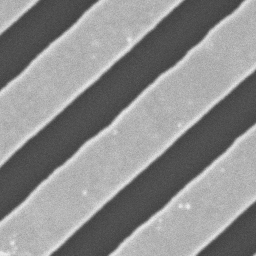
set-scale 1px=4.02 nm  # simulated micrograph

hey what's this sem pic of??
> lines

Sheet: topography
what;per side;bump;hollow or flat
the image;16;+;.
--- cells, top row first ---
++....+++++....+
+....+++++....++
...++++++....+++
..++++++....++++
.++++++...++++++
+++++....++++++.
++++....++++++..
+++....+++++....
++....+++++....+
+....+++++....++
....+++++....+++
...+++++....++++
..+++++....+++++
++++++....+++++.
+++++...++++++..
++++...++++++...